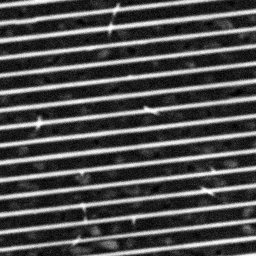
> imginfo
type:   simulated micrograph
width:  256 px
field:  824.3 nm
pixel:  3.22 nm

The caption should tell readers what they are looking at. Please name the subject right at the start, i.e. parallel lines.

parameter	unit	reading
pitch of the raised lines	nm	55.8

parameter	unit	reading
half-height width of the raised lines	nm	8.4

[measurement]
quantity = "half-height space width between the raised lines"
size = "0.0468 µm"